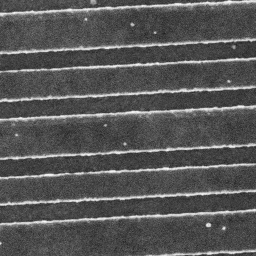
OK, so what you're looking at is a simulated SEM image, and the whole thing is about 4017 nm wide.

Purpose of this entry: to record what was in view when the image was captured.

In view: lines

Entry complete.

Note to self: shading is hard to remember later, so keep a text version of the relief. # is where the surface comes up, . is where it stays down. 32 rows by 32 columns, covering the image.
........................########
....############################
################################
################################
################################
#####################...........
#####...........................
.............................###
..........######################
################################
################################
#####################...........
###.............................
............................####
........########################
################################
################################
################################
##########################......
#######.........................
................................
.............###################
################################
################################
#####################...........
#...............................
.............................###
..........######################
################################
################################
################################
###############################.